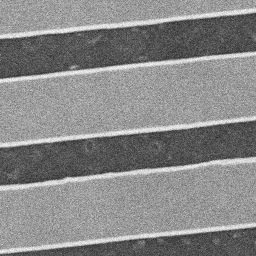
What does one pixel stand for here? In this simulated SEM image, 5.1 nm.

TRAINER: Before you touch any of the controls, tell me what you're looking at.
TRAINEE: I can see one or a few lines or trenches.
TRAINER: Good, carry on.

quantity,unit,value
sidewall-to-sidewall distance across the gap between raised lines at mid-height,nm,213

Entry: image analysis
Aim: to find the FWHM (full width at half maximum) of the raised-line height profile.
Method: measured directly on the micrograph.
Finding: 329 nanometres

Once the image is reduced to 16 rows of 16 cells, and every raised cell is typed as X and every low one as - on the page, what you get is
XXXXXXXXXXXXXXXX
XXXXXXXX--------
----------------
---------------X
-----XXXXXXXXXXX
XXXXXXXXXXXXXXXX
XXXXXXXXXXXXXXXX
XXXXXXXXXXXXXXX-
XXXXXX----------
----------------
-----------XXXXX
---XXXXXXXXXXXXX
XXXXXXXXXXXXXXXX
XXXXXXXXXXXXXXXX
XXXXXXXXXXXX----
XXX-------------